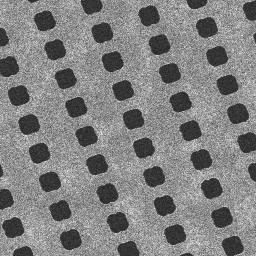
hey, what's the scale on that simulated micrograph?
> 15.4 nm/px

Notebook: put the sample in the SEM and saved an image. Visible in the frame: a regular array of holes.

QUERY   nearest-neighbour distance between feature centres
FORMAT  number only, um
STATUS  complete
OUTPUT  0.47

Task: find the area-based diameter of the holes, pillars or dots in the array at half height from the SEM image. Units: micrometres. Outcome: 0.324